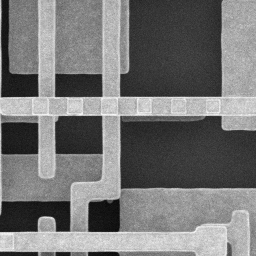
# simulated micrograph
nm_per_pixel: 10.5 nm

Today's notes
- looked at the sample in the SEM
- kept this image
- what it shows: wiring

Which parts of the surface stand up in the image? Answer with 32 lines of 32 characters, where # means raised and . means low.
.....##......##.................
.....##......##.................
.....##......##.................
.....##......##.................
.....##......##.................
.....##......##.................
.....##......##.................
.....##......##.................
.....##......##.................
.....##......##.................
.....##......##.................
.....##......##.................
################################
################################
.....##.....###.................
.....##......##.................
.....##......##.................
.....##......##.................
.....##......##.................
.....##......##.................
.....##......##.................
.....##......##.................
............###.................
.........######.................
.........######.................
.........##.....................
.........##..................##.
.....##..##..................##.
.....##..##..............######.
###############################.
###############################.
....###.###.............####.##.